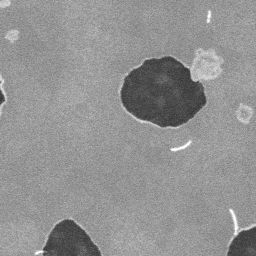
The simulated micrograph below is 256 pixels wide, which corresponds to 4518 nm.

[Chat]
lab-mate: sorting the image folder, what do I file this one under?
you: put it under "holes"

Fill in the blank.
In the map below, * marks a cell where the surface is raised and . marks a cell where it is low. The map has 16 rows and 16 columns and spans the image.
****************
****************
****************
****************
********....****
********.....***
********.....***
*********...****
****************
****************
****************
****************
****************
****************
***..**********.
***...********..